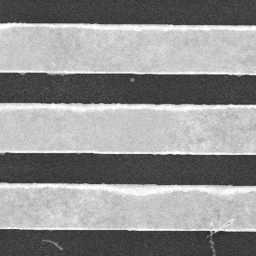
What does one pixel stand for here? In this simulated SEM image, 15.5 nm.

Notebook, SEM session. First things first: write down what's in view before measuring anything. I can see lines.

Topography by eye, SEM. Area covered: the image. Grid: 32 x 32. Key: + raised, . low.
................................
................................
................................
++++++++++++++++++++++++++++++++
++++++++++++++++++++++++++++++++
++++++++++++++++++++++++++++++++
++++++++++++++++++++++++++++++++
++++++++++++++++++++++++++++++++
++++++++++++++++++++++++++++++++
................................
................................
................................
................................
++++++++++++++++++++++++++++++++
++++++++++++++++++++++++++++++++
++++++++++++++++++++++++++++++++
++++++++++++++++++++++++++++++++
++++++++++++++++++++++++++++++++
++++++++++++++++++++++++++++++++
................................
................................
................................
................................
++++++++++++++++++++++++++++++++
++++++++++++++++++++++++++++++++
++++++++++++++++++++++++++++++++
++++++++++++++++++++++++++++++++
++++++++++++++++++++++++++++++++
++++++++++++++++++++++++++++++++
................................
................................
................................